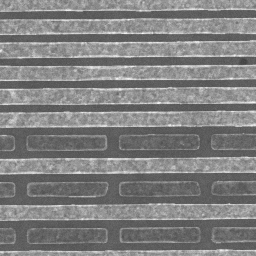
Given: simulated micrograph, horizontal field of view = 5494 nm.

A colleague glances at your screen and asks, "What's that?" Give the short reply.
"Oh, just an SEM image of wiring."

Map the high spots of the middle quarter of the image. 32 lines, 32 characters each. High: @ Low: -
--------------------------------
@@@@@@@@@@@@@@@@@@@@@@@@@@@@@@@@
@@@@@@@@@@@@@@@@@@@@@@@@@@@@@@@@
@@@@@@@@@------@@@@@@@@@@@@@@@@@
--------------------------------
--------------------------------
@@@@@@@@@@----@@@@@@@@@@@@@@@@@@
@@@@@@@@@@@@@@@@@@@@@@@@@@@@@@@@
@@@@@@@@@@@@@@@@@@@@@@@@@@@@@@@@
@@@@@@@@@@@@@@@@@@@@@@@@@@@@@@@@
--------------------------------
--------------------------------
@@@@@@@@@@@@@@@@@@@@@@@@@@@@@@@@
@@@@@@@@@@@@@@@@@@@@@@@@@@@@@@@@
@@@@@@@@@@@@@@@@@@@@@@@@@@@@@@@@
-@@-----------------------------
--------------------------------
--------------------------------
@@@@@@@@@@----@@@@@@@@@@@@@@@@@@
@@@@@@@@@@----@@@@@@@@@@@@@@@@@@
@@@@@@@@@@----@@@@@@@@@@@@@@@@@@
@@@@@---------------------------
--------------------------------
--------------------------------
@@@@@@@@@@@@@@@@@@@@@@@@@@@@@@@@
@@@@@@@@@@@@@@@@@@@@@@@@@@@@@@@@
@@@@@@@@@@@@@@@@@@@@@@@@@@@@@@@@
--------------------------------
--------------------------------
--------------------------------
@@@@@@@@@@@---@@@@@@@@@@@@@@@@@@
@@@@@@@@@@@---@@@@@@@@@@@@@@@@@@